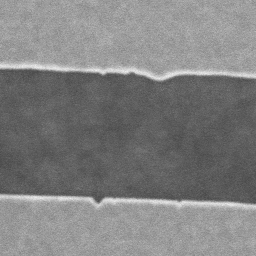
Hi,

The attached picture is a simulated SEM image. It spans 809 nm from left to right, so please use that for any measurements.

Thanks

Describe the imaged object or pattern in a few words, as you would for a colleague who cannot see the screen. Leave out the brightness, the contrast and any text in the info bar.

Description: one or a few lines or trenches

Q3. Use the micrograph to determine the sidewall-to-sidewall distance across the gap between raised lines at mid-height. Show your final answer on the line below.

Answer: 406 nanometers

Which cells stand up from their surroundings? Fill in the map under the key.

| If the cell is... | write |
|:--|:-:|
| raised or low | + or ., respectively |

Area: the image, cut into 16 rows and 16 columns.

++++++++++++++++
++++++++++++++++
++++++++++++++++
++++++++++++++++
.........+++++++
................
................
................
................
................
................
................
++++++.+........
++++++++++++++++
++++++++++++++++
++++++++++++++++